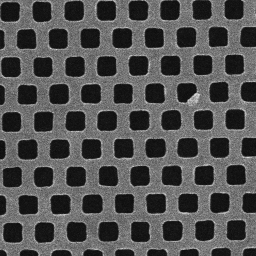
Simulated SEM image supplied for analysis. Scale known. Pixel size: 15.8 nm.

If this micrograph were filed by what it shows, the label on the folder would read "a regular array of holes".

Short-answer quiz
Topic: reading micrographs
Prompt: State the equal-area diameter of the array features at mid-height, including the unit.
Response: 340 nm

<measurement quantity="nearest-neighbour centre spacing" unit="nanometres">498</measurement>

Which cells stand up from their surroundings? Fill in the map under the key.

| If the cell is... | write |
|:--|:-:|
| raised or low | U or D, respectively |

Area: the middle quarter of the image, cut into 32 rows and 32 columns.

DDDDDUUUDDDDDUUUDDDDDUUUDDDDDUUU
DDDDDUUUDDDDDUUUDDDDDUUUDDDDDUUU
UDDDDUUUDDDDDUUUUDDDDUUUUDDDDUUU
UUUUUUUUUUUUUUUUUUUUUUUUUUUUUUUU
UUUUUUUUUUUUUUUUUUUUUUUUUUUUUUUU
DUUUUDDDDUUUDDDDDUUUUDDDDUUUDDDD
DUUUDDDDDUUUDDDDDUUUDDDDDUUUDDDD
DUUUDDDDDUUUDDDDDUUUDDDDDUUUDDDD
DUUUDDDDDUUUDDDDDUUUDDDDDUUUDDDD
DUUUUDDDDUUUDDDDDUUUUDDDDUUUUDDU
UUUUUUUUUUUUUUUUUUUUUUUUUUUUUUUU
UUUUUUUUUUUUUUUUUUDDUUUUUUDDUUUU
UDDDDUUUUDDDDUUUDDDDDUUUDDDDDUUU
DDDDDDUUDDDDDUUUDDDDDUUUDDDDDUUU
DDDDDUUUDDDDDUUUDDDDDDUUDDDDDUUU
DDDDDDUUDDDDDUUUUDDDDUUUDDDDDUUU
UDDDDUUUUDDDDUUUUDDDUUUUUDDDUUUU
UUUUUUUUUUUUUUUUUUUUUUUUUUUUUUUU
UUUUUUUUUUUUUUUUUUUUUDUUUUUUUUDD
DUUUDDDDDUUUUDDDDUUUUDDDDUUUDDDD
DUUUDDDDDUUUDDDDDUUUDDDDDDUUDDDD
DUUUDDDDDUUUDDDDDUUUDDDDDDUUDDDD
DUUUDDDDDDUUDDDDDUUUUDDDDUUUDDDD
DUUUUDDDUUUUUDUUUUUUUDDDUUUUUUUU
UUUUUUUUUUUUUUUUUUUUUUUUUUUUUUUU
UUUUUUUUUUDDUUUUUUUDUUUUUDDDDUUU
UDDDDUUUUDDDDUUUUDDDDUUUUDDDDUUU
UDDDDDUUUDDDDDUUDDDDDDUUDDDDDUUU
DDDDDDUUUDDDDDUUDDDDDDUUDDDDDDUU
DDDDDUUUUDDDDDUUUDDDDUUUUDDDDUUU
UDDDDUUUUUDDDUUUUUDDUUUUUUUDDUUU
UUUUUUUUUUUUUUUUUUUUUUUUUUUUUUUU